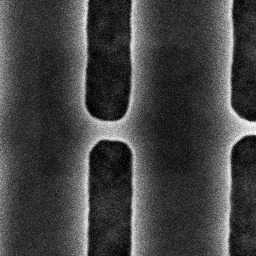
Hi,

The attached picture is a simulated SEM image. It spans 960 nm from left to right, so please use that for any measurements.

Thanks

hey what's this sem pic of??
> holes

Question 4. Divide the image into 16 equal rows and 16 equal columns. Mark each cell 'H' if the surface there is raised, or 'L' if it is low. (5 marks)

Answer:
HHHHHLLLHHHHHHLL
HHHHHLLLHHHHHHHL
HHHHHLLLHHHHHHHL
HHHHHLLLHHHHHHHL
HHHHHLLLHHHHHHLL
HHHHHLLLHHHHHHLL
HHHHHLLLHHHHHHLL
HHHHHHLHHHHHHHHL
HHHHHHHHHHHHHHHL
HHHHHHLLHHHHHHLL
HHHHHHLLHHHHHHLL
HHHHHLLLHHHHHHLL
HHHHHHLLHHHHHHLL
HHHHHHLLHHHHHHLL
HHHHHLLLHHHHHHLL
HHHHHLLLHHHHHHLL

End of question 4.